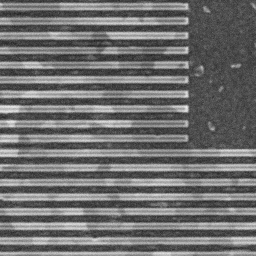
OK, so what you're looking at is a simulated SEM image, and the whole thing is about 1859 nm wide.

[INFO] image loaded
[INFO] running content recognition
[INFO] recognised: parallel lines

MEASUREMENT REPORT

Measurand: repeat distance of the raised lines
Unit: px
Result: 14.6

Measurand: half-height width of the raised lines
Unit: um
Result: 0.0372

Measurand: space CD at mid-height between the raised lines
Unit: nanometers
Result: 69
